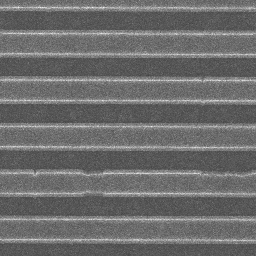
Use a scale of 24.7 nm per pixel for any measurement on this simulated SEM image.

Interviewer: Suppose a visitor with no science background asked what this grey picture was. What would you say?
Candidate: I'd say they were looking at parallel lines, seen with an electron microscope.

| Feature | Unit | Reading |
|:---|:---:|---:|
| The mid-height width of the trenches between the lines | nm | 581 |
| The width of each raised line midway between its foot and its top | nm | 578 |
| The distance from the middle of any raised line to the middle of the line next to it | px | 46.5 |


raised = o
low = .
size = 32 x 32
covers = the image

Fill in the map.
oooooooooooooooooooooooooooooooo
................................
................................
................................
oooooooooooooooooooooooooooooooo
oooooooooooooooooooooooooooooooo
oooooooooooooooooooooooooooooooo
................................
................................
................................
oooooooooooooooooooooooooooooooo
oooooooooooooooooooooooooooooooo
oooooooooooooooooooooooooooooooo
................................
................................
................................
oooooooooooooooooooooooooooooooo
oooooooooooooooooooooooooooooooo
.................ooooooooooooooo
................................
................................
................................
oooooooooooooooooooooooooooooooo
oooooooooooooooooooooooooooooooo
................................
................................
................................
oooooooooooooooooooooooooooooooo
oooooooooooooooooooooooooooooooo
oooooooooooooooooooooooooooooooo
................................
................................